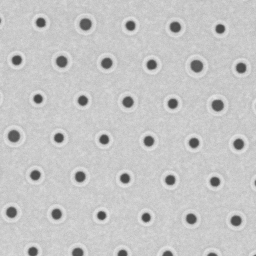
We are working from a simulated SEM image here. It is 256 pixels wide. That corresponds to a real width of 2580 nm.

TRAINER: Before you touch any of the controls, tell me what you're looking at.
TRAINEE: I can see a regular array of ring-shaped raised bodies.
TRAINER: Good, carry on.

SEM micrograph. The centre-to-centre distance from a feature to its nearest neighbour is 0.442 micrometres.